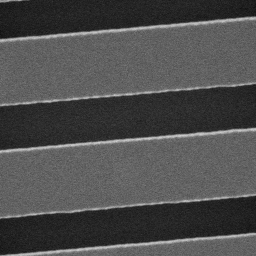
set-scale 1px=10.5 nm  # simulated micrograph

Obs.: lines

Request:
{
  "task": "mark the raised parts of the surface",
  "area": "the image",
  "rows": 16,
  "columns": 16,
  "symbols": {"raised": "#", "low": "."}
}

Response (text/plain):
................
...........#####
################
################
################
#############...
#...............
................
..........######
################
################
################
#############...
#...............
................
.....###########